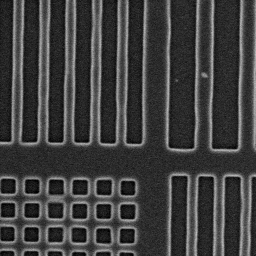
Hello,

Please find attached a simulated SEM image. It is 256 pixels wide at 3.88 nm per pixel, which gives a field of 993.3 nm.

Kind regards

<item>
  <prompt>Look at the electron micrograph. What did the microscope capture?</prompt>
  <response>groups of lines, slits or small figures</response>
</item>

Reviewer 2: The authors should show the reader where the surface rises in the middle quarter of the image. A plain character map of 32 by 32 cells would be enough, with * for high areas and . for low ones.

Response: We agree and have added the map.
.*.....**....***....******......
.*.....**....***....******......
**.....**....***....******......
**.....**....***....******......
***....**....***....******......
***....**....***....******......
***....**....***....******......
***....**....***....******......
**.....**....***....******......
**.....**....**.....******......
**.....**....**.....******......
**.....**....**.....******......
**.....**....**.....******......
**.....**....**.....******......
**.....**....**.....******......
**.....**....**.....******......
**.....**....**.....******......
**.....**....**.....******......
**.....**....**.....******......
***...***....**.....******......
**************************......
********************************
********************************
********************************
********************************
********************************
********************************
********************************
***************************....*
**....**....**....*********....*
**....**....**....*********....*
**....**....**....*********....*